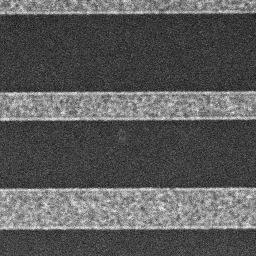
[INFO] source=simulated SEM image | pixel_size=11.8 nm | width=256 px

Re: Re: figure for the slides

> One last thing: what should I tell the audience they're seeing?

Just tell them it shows one or a few lines or trenches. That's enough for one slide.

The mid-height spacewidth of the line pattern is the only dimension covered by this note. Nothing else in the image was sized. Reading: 890 nm